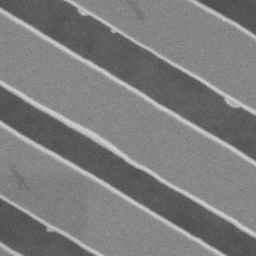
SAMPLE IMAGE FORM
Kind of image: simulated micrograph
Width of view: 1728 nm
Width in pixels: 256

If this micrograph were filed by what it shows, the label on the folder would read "lines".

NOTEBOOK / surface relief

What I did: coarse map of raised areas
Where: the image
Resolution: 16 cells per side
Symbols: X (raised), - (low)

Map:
-----XXXXXXXX---
XX-----XXXXXXXX-
XXX-----XXXXXXXX
XXXXX-----XXXXXX
XXXXXXX-----XXXX
XXXXXXXX-----XXX
--XXXXXXXX-----X
----XXXXXXXX----
XX---XXXXXXXX---
XXX----XXXXXXXX-
XXXXX----XXXXXXX
XXXXXXX---XXXXXX
XXXXXXXX----XXXX
--XXXXXXXX----XX
----XXXXXXXX---X
X----XXXXXXXX---